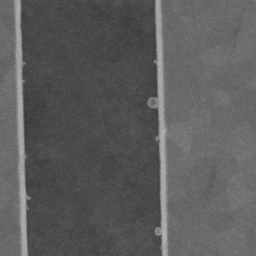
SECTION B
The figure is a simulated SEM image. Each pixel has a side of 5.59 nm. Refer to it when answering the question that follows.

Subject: one or a few lines or trenches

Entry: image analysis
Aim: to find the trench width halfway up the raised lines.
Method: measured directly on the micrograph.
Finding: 784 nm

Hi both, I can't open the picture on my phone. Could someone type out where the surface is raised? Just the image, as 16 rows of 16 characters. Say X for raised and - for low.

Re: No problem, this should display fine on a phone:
X---------XXXXXX
X---------XXXXXX
X---------XXXXXX
X---------XXXXXX
X---------XXXXXX
X---------XXXXXX
X---------XXXXXX
X---------XXXXXX
X---------XXXXXX
X---------XXXXXX
X---------XXXXXX
X---------XXXXXX
X---------XXXXXX
X---------XXXXXX
X---------XXXXXX
XX--------XXXXXX